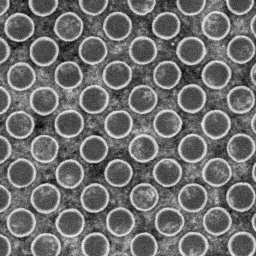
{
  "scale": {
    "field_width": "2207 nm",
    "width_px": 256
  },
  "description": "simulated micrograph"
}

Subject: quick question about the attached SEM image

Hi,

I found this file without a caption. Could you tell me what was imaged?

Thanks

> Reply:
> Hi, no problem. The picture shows a regular array of raised bodies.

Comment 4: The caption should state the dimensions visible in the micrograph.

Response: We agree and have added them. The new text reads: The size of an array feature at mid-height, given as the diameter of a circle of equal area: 233 nm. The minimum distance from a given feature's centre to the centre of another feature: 34.2 px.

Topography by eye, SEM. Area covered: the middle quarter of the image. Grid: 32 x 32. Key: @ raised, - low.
@@@--------@@@@@-------@@@@@----
@@@@------@@@@@@@------@@@@@@---
@@@@------@@@@@@@------@@@@@@---
@@@@------@@@@@@@------@@@@@@---
@@@@------@@@@@@-------@@@@@----
@@@----@---@@@@---------@@@----@
-----@@@@@-------@@@@@-------@@@
-----@@@@@@------@@@@@@------@@@
----@@@@@@@-----@@@@@@@------@@@
----@@@@@@@-----@@@@@@@------@@@
----@@@@@@-------@@@@@@------@@@
-----@@@@@-------@@@@@--------@@
@@@@--------@@@@--------@@@@----
@@@@@------@@@@@@------@@@@@@---
@@@@@-----@@@@@@@------@@@@@@---
@@@@@-----@@@@@@@------@@@@@@---
@@@@-------@@@@@-------@@@@@@---
@@@--------@@@@@--------@@@@----
------@@@---------@@@@--------@@
-----@@@@@-------@@@@@@------@@@
----@@@@@@@------@@@@@@------@@@
----@@@@@@@-----@@@@@@@------@@@
----@@@@@@@------@@@@@@------@@@
-----@@@@@-------@@@@@--------@@
@@@----@----@@@---------@@@@----
@@@@-------@@@@@-------@@@@@@---
@@@@@-----@@@@@@@------@@@@@@---
@@@@@-----@@@@@@@-----@@@@@@@---
@@@@@-----@@@@@@@------@@@@@@---
@@@@-------@@@@@--------@@@@----
@@@---@@@---------@@@@---------@
-----@@@@@-------@@@@@@-------@@